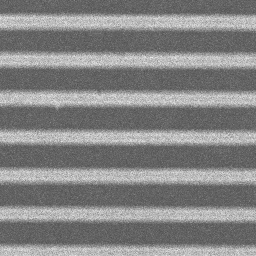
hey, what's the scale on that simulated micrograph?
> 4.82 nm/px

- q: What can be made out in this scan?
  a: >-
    parallel lines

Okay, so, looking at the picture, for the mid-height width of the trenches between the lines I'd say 0.127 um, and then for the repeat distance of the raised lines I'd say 0.185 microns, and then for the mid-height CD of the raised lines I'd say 59.7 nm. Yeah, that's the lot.